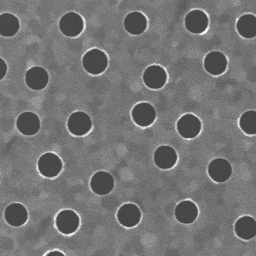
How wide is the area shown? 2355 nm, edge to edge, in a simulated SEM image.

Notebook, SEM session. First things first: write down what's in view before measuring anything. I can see a regular array of holes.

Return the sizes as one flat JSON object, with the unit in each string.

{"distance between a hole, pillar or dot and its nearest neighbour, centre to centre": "418 nm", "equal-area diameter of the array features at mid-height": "217 nm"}